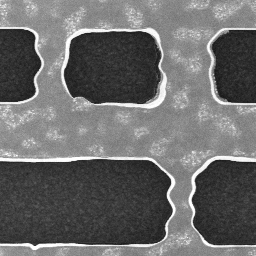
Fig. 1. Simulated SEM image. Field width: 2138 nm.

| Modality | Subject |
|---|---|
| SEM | one or a few lines or trenches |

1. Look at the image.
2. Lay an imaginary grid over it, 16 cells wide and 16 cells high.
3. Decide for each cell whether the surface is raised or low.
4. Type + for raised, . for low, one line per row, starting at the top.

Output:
++++++++++++++++
++++++++++++++++
..++......+++...
..++......+++...
..++......+++...
..++......+++...
++++++....+++++.
++++++++++++++++
++++++++++++++++
++++++++++++++++
..........+++...
...........+....
...........+....
...........+....
..........++....
++++++++++++++++